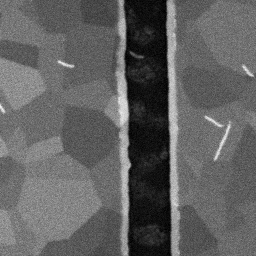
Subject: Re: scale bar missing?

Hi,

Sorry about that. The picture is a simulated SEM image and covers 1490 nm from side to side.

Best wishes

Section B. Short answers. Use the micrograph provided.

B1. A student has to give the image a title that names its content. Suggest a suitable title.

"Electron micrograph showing one or a few lines or trenches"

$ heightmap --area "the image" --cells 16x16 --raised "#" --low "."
########...#####
########...#####
########...#####
########...#####
########...#####
########...#####
########...#####
########...#####
########...#####
########...#####
########...#####
########...#####
########...#####
########...#####
########...#####
########...#####